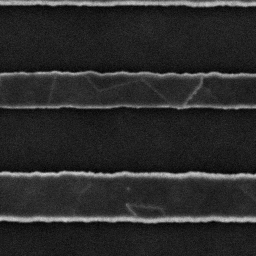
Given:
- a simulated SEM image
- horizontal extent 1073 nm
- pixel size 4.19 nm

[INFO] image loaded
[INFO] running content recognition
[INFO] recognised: lines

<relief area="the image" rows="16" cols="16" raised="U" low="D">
DDDDDDDDDDDDDDDD
DDDDDDDDDDDDDDDD
DDDDDDDDDDDDDDDD
DDDDDDDDDDDDDDDD
DDDUDUDDDDDDDDDD
UUUUUUUUUUUUUUUU
UUUUUUUUUUUUUUUU
DDDDDDDDDDDDDDDD
DDDDDDDDDDDDDDDD
DDDDDDDDDDDDDDDD
DDDDDDDDDDDDDDDD
UUUUUUUUUUUUUUUU
UUUUUUUUUUUUUUUU
UUUUUUUUUUUUUUUU
DDDDDDDDDDDDDDDD
DDDDDDDDDDDDDDDD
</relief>